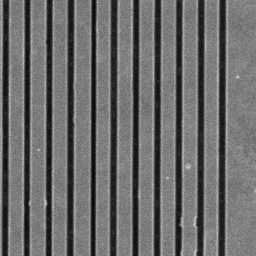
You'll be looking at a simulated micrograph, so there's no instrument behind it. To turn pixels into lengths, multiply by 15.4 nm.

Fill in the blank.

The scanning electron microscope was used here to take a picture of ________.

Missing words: parallel lines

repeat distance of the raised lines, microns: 0.334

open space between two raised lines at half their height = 6.88 px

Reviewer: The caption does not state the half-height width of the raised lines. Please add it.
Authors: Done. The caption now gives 230 nm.